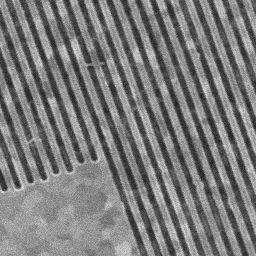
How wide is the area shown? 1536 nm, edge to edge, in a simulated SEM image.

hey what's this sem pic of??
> parallel lines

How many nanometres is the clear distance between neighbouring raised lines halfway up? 50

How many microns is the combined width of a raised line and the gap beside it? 0.0813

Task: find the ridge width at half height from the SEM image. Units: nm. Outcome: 35.2